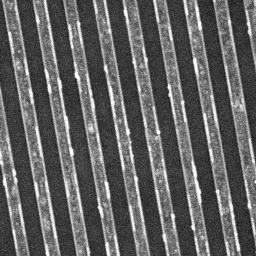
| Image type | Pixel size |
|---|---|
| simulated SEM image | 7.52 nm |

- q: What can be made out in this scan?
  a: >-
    parallel lines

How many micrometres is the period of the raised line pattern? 0.223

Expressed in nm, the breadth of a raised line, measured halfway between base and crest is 97.2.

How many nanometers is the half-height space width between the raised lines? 128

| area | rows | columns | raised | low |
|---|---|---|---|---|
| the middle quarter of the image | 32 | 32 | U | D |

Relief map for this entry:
DDDUUUDDDDUUUDDDDDUUUDDDDUUUDDDD
DDDUUUDDDDUUUDDDDDUUUDDDDUUUDDDD
DDDUUUDDDDDUUUDDDDUUUDDDDDUUUDDD
DDDUUUDDDDDUUUDDDDUUUDDDDDUUUDDD
DDDUUUDDDDDUUUDDDDUUUDDDDDUUUDDD
DDDDUUDDDDDUUUDDDDUUUUDDDDUUUDDD
DDDDUUUDDDDUUUDDDDDUUUDDDDUUUDDD
DDDDUUUDDDDUUUDDDDDUUUDDDDUUUDDD
DDDDUUUDDDDDUUUDDDDUUUDDDDDUUUDD
DDDDUUUDDDDDUUUDDDDUUUDDDDDUUUDD
DDDDDUUUDDDDUUUDDDDUUUUDDDDUUUDD
DDDDDUUDDDDDUUUDDDDDUUUDDDDUUUDD
DDDDDUUUDDDDUUUDDDDDUUUDDDDUUUDD
UDDDDUUUDDDDDUUDDDDDUUUDDDDUUUDD
UDDDDUUUDDDDDUUUDDDDUUUDDDDDUUUD
UDDDDDUUDDDDDUUUDDDDUUUDDDDDUUUD
UDDDDDUUDDDDDUUUDDDDUUUUDDDDUUUD
UDDDDDUUUDDDDUUUDDDDDUUUDDDDUUUD
UDDDDDUUUDDDDUUUDDDDDUUUDDDDUUUD
UUDDDDUUUDDDDDUUUDDDDUUUDDDDDUUD
UUDDDDUUUDDDDDUUUDDDDUUUDDDDDUUU
UUDDDDDUUDDDDDUUUDDDDUUUDDDDDUUU
UUDDDDDUUDDDDDUUUDDDDUUUUDDDDUUU
UUDDDDDUUUDDDDUUUDDDDDUUUDDDDUUU
UUDDDDDUUUDDDDUUUDDDDDUUUDDDDUUU
UUUDDDDUUUDDDDDUUUDDDDUUUDDDDDUU
UUUDDDDUUUDDDDDUUUDDDDUUUDDDDDUU
UUUDDDDUUUDDDDDUUUDDDDUUUDDDDDUU
UUUDDDDUUUDDDDDUUUDDDDUUUUDDDDUU
UUUDDDDDUUUDDDDUUUDDDDDUUUDDDDUU
UUUDDDDDUUUDDDDUUUDDDDDUUUDDDDUU
UUUUDDDDUUUDDDDDUUUDDDDUUUDDDDDU